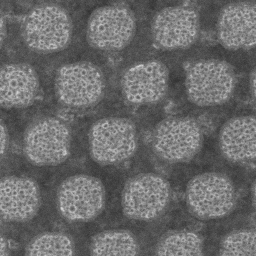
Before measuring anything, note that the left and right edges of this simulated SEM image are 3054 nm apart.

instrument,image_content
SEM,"a regular array of raised bodies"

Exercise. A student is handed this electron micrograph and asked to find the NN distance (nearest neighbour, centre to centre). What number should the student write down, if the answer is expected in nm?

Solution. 766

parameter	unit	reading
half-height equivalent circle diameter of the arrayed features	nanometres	510